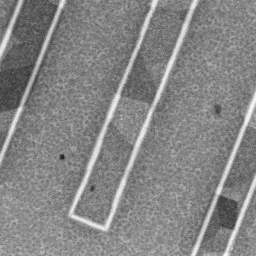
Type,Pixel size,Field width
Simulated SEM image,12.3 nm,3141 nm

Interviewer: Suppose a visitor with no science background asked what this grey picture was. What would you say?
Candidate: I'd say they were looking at one or a few lines or trenches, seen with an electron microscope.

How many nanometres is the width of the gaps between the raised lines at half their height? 1070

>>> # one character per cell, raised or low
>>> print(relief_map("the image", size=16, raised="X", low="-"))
-XXX------XX----
-XX------XXX----
XXX------XX-----
XXX-----XXX-----
XX------XX------
XX------XX------
X------XXX------
X------XX------X
X-----XXX------X
------XX-------X
------XX------XX
-----XXX------XX
-----XX------XX-
-----XX------XX-
-------------XX-
------------XX--